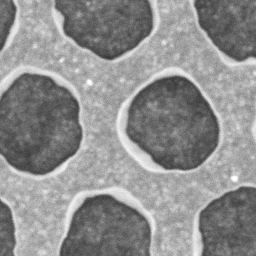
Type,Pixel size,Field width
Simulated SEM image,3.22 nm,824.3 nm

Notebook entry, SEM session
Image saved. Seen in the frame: holes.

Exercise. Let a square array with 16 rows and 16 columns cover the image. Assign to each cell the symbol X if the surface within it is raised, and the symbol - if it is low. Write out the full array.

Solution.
-XX-------XX----
-XXX------XX----
XXXX-----XXXX---
XXXXXX--XXXXXX--
X-XXXXXXXXXXXXXX
----XXXXX---XXXX
-----XXX-----XXX
-----XXX------XX
-----XXX------XX
-----XXXX----XXX
X---XXXXXX--XXXX
XXXXXXXXXXXXXXXX
XXXXX---XXXXX---
-XXX-----XXX----
-XXX-----XXX----
-XXX-----XXX----